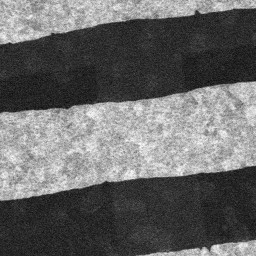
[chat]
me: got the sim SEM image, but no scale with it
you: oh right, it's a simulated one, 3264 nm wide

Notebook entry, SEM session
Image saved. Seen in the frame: one or a few lines or trenches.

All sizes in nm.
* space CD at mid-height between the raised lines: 949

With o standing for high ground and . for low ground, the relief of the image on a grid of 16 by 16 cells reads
ooooooooooooooo.
oooooo..........
oo..............
................
................
.............ooo
......oooooooooo
oooooooooooooooo
oooooooooooooooo
oooooooooooooooo
ooooooooooooooo.
oooooo..........
................
................
................
.............ooo